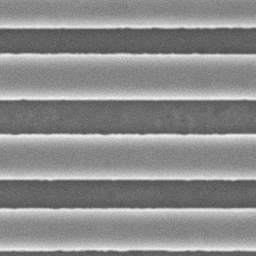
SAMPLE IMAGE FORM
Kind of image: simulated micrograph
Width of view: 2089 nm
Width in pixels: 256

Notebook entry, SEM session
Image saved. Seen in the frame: lines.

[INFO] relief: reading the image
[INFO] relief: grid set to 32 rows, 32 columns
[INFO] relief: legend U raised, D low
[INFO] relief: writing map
UUUUUUUUUUUUUUUUUUUUUUUUUUUUUUUU
UUUUUUUUUUUUUUUUUUUUUUUUUUUUUUUU
UUUUUUUUUUUUUUUUUUUUUUUUUUUUUUUU
DDDDDDDDDDDDDDDDDDDDDDDDDDDDDDDD
DDDDDDDDDDDDDDDDDDDDDDDDDDDDDDDD
DDDDDDDDDDDDDDDDDDDDDDDDDDDDDDDD
DDDDDDDDDDDDDDDDDDDDDDDDDDDDDDDD
UUUUUUUUUUUUUUUUUUUUUUUUUUUUUUUU
UUUUUUUUUUUUUUUUUUUUUUUUUUUUUUUU
UUUUUUUUUUUUUUUUUUUUUUUUUUUUUUUU
UUUUUUUUUUUUUUUUUUUUUUUUUUUUUUUU
UUUUUUUUUUUUUUUUUUUUUUUUUUUUUUUU
DDDDDDDDDDDDDDDDDDDDDDDDDDDDDDDD
DDDDDDDDDDDDDDDDDDDDDDDDDDDDDDDD
DDDDDDDDDDDDDDDDDDDDDDDDDDDDDDDD
DDDDDDDDDDDDDDDDDDDDDDDDDDDDDDDD
DDDDDDDDDDDDDDDDDDDDDDDDDDDDDDDD
UUUUUUUUUUUUUUUUUUUUUUUUUUUUUUUU
UUUUUUUUUUUUUUUUUUUUUUUUUUUUUUUU
UUUUUUUUUUUUUUUUUUUUUUUUUUUUUUUU
UUUUUUUUUUUUUUUUUUUUUUUUUUUUUUUU
UUUUUUUUUUUUUUUUUUUUUUUUUUUUUUUU
DDDDDDDDDDDDDDDDDDDDDDDDDDDDDDDD
DDDDDDDDDDDDDDDDDDDDDDDDDDDDDDDD
DDDDDDDDDDDDDDDDDDDDDDDDDDDDDDDD
DDDDDDDDDDDDDDDDDDDDDDDDDDDDDDDD
UUUUUUUUUUUUUUUUUUUUUUUUUUUUUUUU
UUUUUUUUUUUUUUUUUUUUUUUUUUUUUUUU
UUUUUUUUUUUUUUUUUUUUUUUUUUUUUUUU
UUUUUUUUUUUUUUUUUUUUUUUUUUUUUUUU
UUUUUUUUUUUUUUUUUUUUUUUUUUUUUUUU
DDDDDDDDDDDDDDDDDDDDDDDDDDDDDDDD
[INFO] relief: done